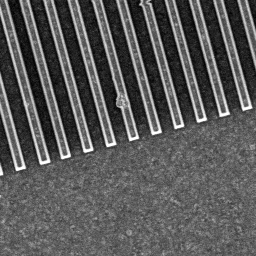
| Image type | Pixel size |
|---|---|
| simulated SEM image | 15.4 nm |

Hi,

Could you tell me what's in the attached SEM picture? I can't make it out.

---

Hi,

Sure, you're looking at parallel lines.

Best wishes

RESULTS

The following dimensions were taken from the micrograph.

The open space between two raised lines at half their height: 235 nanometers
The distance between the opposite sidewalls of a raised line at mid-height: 132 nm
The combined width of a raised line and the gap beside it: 360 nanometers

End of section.